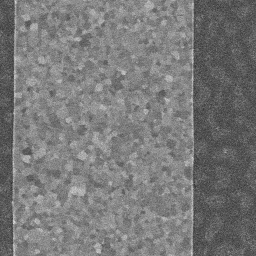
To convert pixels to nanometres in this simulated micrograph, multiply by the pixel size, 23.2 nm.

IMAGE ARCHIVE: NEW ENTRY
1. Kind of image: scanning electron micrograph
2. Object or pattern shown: one or a few lines or trenches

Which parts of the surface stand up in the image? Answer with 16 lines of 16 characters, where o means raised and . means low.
.ooooooooooo....
.ooooooooooo....
.ooooooooooo....
.ooooooooooo....
.ooooooooooo....
.ooooooooooo....
.ooooooooooo....
.ooooooooooo....
.ooooooooooo....
.ooooooooooo....
.ooooooooooo....
.ooooooooooo....
.ooooooooooo....
.ooooooooooo....
.ooooooooooo....
.ooooooooooo....